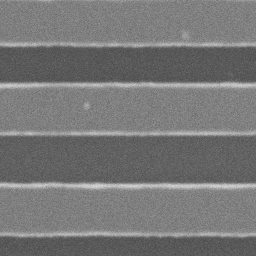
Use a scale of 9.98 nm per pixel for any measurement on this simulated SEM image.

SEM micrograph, lines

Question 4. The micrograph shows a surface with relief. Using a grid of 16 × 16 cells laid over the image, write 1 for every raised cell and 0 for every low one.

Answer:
1111111111111111
1111111111111111
1111111111111111
0000000000000000
0000000000000000
1111111111111111
1111111111111111
1111111111111111
0000000000000000
0000000000000000
0000000000000000
0000000000000000
1111111111111111
1111111111111111
1111111111111111
0000000000000000